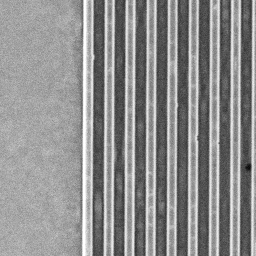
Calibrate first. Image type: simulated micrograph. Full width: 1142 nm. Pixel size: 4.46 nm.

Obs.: parallel lines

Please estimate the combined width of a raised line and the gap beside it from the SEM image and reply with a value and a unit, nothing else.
93.9 nm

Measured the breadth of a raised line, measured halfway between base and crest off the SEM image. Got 36.8 nm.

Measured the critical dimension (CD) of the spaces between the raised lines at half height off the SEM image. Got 12.9 px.